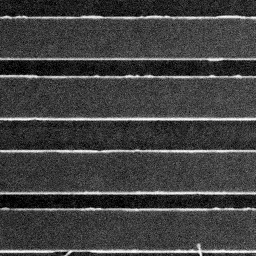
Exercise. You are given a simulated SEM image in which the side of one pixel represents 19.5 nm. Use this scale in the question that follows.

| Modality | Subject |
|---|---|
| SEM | lines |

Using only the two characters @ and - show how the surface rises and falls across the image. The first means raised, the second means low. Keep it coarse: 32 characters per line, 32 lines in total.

--------------------------------
--------------------------------
@@@@@@@@@@@@@@@@@@@@@@@@@@@@@@@@
@@@@@@@@@@@@@@@@@@@@@@@@@@@@@@@@
@@@@@@@@@@@@@@@@@@@@@@@@@@@@@@@@
@@@@@@@@@@@@@@@@@@@@@@@@@@@@@@@@
@@@@@@@@@@@@@@@@@@@@@@@@@@@@@@@@
--------------------------------
--------------------------------
@@@@@----------@@-@----------@--
@@@@@@@@@@@@@@@@@@@@@@@@@@@@@@@@
@@@@@@@@@@@@@@@@@@@@@@@@@@@@@@@@
@@@@@@@@@@@@@@@@@@@@@@@@@@@@@@@@
@@@@@@@@@@@@@@@@@@@@@@@@@@@@@@@@
@@@@@@@@@@@@@@@@@@@@@@@@@@@@@@@@
--------------------------------
--------------------------------
--------------------------------
--------------------------------
@@@@@@@@@@@@@@@@@@@@@@@@@@@@@@@@
@@@@@@@@@@@@@@@@@@@@@@@@@@@@@@@@
@@@@@@@@@@@@@@@@@@@@@@@@@@@@@@@@
@@@@@@@@@@@@@@@@@@@@@@@@@@@@@@@@
@@@@@@@@@@@@@@@@@@@@@@@@@@@@@@@@
--------------------------------
--------------------------------
@@@@@@@@@@@@@@@@@@@@@@@@@@@@@@@@
@@@@@@@@@@@@@@@@@@@@@@@@@@@@@@@@
@@@@@@@@@@@@@@@@@@@@@@@@@@@@@@@@
@@@@@@@@@@@@@@@@@@@@@@@@@@@@@@@@
@@@@@@@@@@@@@@@@@@@@@@@@@@@@@@@@
--------@---------------@@------